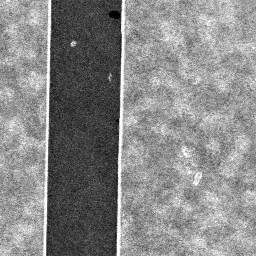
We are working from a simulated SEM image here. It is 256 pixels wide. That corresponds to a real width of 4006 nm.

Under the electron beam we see one or a few lines or trenches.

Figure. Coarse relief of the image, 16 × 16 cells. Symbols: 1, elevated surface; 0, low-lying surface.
1110000011111111
1110000011111111
1110000011111111
1110000011111111
1110000011111111
1110000011111111
1110000011111111
1110000011111111
1110000011111111
1110000111111111
1110000111111111
1110000111111111
1110000111111111
1110000111111111
1110000111111111
1110000111111111